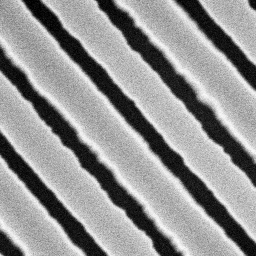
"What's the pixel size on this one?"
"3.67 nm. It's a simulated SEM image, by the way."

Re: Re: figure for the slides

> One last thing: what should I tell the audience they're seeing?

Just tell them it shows lines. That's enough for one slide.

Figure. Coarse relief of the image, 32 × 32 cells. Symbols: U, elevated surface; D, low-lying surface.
UUUDDDUUUUUUDDDUUUUUUUDDDUUUUUUD
UUUUDDDUUUUUUDDDUUUUUUUDDDUUUUUU
UUUUUDDUUUUUUUDDDUUUUUUUDDDUUUUU
UUUUUUDDUUUUUUDDDDUUUUUUUDDDUUUU
UUUUUUDDDUUUUUUDDDUUUUUUUUDDDUUU
UUUUUUUDDDUUUUUUDDDUUUUUUUUDDDUU
DUUUUUUUDDDUUUUUUDDDUUUUUUUUDDUU
DUUUUUUUUDDDUUUUUUDDDUUUUUUUUDDU
DDDUUUUUUUDDDUUUUUUDDDUUUUUUUDDD
UDDUUUUUUUUDDDUUUUUUDDDUUUUUUUDD
UDDDUUUUUUUUDDDUUUUUUDDDUUUUUUUD
UUDDDUUUUUUUDDDUUUUUUDDDDUUUUUUU
UUUDDDUUUUUUUUDDDUUUUUDDDUUUUUUU
UUUUDDDUUUUUUUDDDUUUUUUDDDDUUUUU
UUUUUDDDUUUUUUUDDDUUUUUUDDDUUUUU
UUUUUUDDDUUUUUUUDDDUUUUUUDDDUUUU
UUUUUUDDDDUUUUUUUDDDUUUUUDDDDUUU
DUUUUUUDDDUUUUUUUUDDDUUUUUDDDDUU
DDUUUUUUDDDUUUUUUUUDDUUUUUUUDDDU
DDDUUUUUUDDDUUUUUUUUDDDUUUUUUDDD
UDDDUUUUUUDDDUUUUUUUDDDUUUUUUDDD
UUDDUUUUUUUDDDUUUUUUUDDDUUUUUUDD
UUUDDUUUUUUUDDDUUUUUUUDDDUUUUUUD
UUUDDDUUUUUUUDDDUUUUUUUDDDUUUUUU
UUUUDDDUUUUUUDDDDUUUUUUUDDDUUUUU
UUUUUDDDUUUUUUDDDDUUUUUUUDDDUUUU
UUUUUUDDDUUUUUUUDDUUUUUUUUDDDUUU
UUUUUUUDDDUUUUUUDDDUUUUUUUUDDUUU
UUUUUUUUDDDUUUUUUDDDUUUUUUUUDDUU
DUUUUUUUDDDUUUUUUUDDDUUUUUUUDDDU
DDUUUUUUUDDDUUUUUUUDDDUUUUUUUDDD
DDDUUUUUUUDDDUUUUUUDDDDUUUUUUUDD